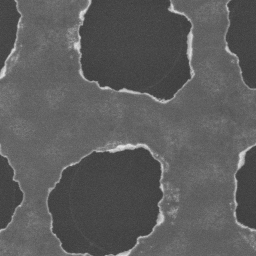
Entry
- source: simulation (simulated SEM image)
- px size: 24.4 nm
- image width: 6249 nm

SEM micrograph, holes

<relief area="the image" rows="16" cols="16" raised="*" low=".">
.****......***..
.****.......**..
.****.......**..
.****.......***.
*****.......***.
*******....*****
****************
****************
****************
******...******.
.***......*****.
.***......*****.
.**.......*****.
.**.......*****.
***......*******
****....********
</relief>